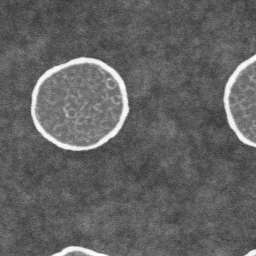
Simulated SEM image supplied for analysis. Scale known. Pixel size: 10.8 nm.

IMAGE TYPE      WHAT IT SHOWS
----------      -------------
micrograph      raised bodies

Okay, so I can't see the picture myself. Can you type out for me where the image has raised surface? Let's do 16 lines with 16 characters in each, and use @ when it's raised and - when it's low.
----------------
----------------
----------------
----------------
---@@@@--------@
--@@@@@@------@@
--@@@@@@------@@
--@@@@@@------@@
---@@@@--------@
----------------
----------------
----------------
----------------
----------------
----------------
----------------